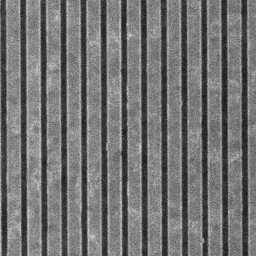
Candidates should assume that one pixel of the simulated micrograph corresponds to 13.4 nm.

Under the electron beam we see parallel lines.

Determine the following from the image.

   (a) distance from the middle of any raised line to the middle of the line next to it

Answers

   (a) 270 nanometers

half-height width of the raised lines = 0.173 µm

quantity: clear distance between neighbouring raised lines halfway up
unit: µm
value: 0.0925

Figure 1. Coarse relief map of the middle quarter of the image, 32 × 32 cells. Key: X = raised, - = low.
-XXX--XXX--XXX--XXX--XXX--XXX--X
-XXX--XXX--XXX--XXX--XXX--XXX--X
-XXX--XXX--XXX--XXX--XXX--XXX--X
-XXX--XXX--XXX--XXX--XXX--XXX--X
-XXX--XXX--XXX--XXX--XXX--XXX--X
-XXX--XXX--XXX--XXX--XXX--XXX--X
-XXX--XXX--XXX--XXX--XXX--XXX--X
-XXX--XXX--XXX--XXX--XXX--XXX--X
-XXX--XXX--XXX--XXX--XXX--XXX--X
-XXX--XXX--XXX--XXX--XXX--XXX--X
-XXX--XXX--XXX--XXX--XXX--XXX--X
-XXX--XXX--XXX--XXX--XXX--XXX--X
-XXX--XXX--XXX--XXX--XXX--XXX--X
-XXX--XXX--XXX--XXX--XXX--XXX--X
-XXX--XXX--XXX--XXX--XXX--XXX--X
-XXX--XXX--XXX--XXX--XXX--XXX--X
-XXX--XXX--XXX--XXX--XXX--XXX--X
-XXX--XXX--XXX--XXX--XXX--XXX--X
-XXX--XXX--XXX--XXX--XXX--XXX--X
-XXX--XXX--XXX--XXX--XXX--XXX--X
-XXX--XXX--XXX--XXX--XXX--XXX--X
-XXX--XXX--XXX--XXX--XXX--XXX--X
-XXX--XXX--XXX--XXX--XXX--XXX--X
-XXX--XXX--XXX--XXX--XXX--XXX--X
-XXX--XXX--XXX--XXX--XXX--XXX--X
-XXX--XXX--XXX--XXX--XXX--XXX--X
-XXX--XXX--XXX--XXX--XXX--XXX--X
-XXX--XXX--XXX--XXX--XXX--XXX--X
-XXX--XXX--XXX--XXX--XXX--XXX--X
-XXX--XXX--XXX--XXX--XXX--XXX--X
-XXX--X-X--XXX--XXX--XXX--XXX--X
-XXX--XXX--XXX--XXX--XXX--XXX--X